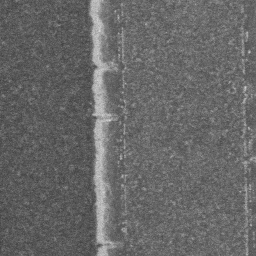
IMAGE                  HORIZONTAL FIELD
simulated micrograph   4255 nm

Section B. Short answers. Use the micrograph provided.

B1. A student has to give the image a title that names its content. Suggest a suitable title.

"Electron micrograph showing one or a few lines or trenches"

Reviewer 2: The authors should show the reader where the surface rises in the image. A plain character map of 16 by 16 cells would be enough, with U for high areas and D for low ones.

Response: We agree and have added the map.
DDDDDDUUUUUUUUUU
DDDDDDUUUUUUUUUU
DDDDDDUUUUUUUUUU
DDDDDDUUUUUUUUUU
DDDDDDUUUUUUUUUU
DDDDDDUUUUUUUUUU
DDDDDDUUUUUUUUUU
DDDDDDUUUUUUUUUU
DDDDDDUUUUUUUUUU
DDDDDDUUUUUUUUUU
DDDDDDUUUUUUUUUU
DDDDDDUUUUUUUUUU
DDDDDDUUUUUUUUUU
DDDDDDUUUUUUUUUU
DDDDDDUUUUUUUUUU
DDDDDDUUUUUUUUUU